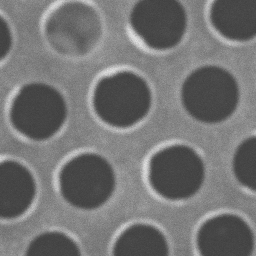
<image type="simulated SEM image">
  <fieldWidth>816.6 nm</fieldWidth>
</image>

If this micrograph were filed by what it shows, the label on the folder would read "holes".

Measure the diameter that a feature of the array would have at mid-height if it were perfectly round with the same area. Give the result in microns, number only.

0.178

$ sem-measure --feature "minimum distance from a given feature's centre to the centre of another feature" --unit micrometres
0.271